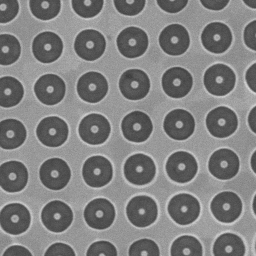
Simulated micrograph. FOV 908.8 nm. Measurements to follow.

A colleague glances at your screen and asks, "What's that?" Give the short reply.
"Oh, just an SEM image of an array of small figures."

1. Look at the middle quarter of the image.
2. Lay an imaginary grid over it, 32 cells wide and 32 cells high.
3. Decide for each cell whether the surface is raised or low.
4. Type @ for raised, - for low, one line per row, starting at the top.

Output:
@@@@@@@@@@@@@@@@@@@@@@@@@@@@@@@@
@@@@@@@@@@@@@@@@---@@@@@@@-----@
@@@@@----@@@@@@------@@@@-------
@@@@------@@@@-------@@@--------
@@@--------@@@---@----@@----@---
@@@---@@---@@@---@----@@--------
@@@--------@@@-------@@@@-------
@@@--------@@@-------@@@@------@
@@@@------@@@@@-----@@@@@@@--@@@
@@@@@@---@@@@@@@@@@@@@@@@@@@@@@@
@@@@@@@@@@@@@@@@@@@@@@@@@@@@@@@@
@@@@@@@@@@@@@@@@@@@@@@@@@@@---@@
@@@@@@---@@@@@@@-----@@@@@------
@@@@@------@@@@-------@@@-------
@@@@-------@@@--------@@@-------
-@@@--------@@---@@---@@@---@---
-@@----@----@@----@---@@@-------
-@@@--------@@@-------@@@@------
-@@@-------@@@@------@@@@@@----@
@@@@@-----@@@@@@@---@@@@@@@@@@@@
@@@@@@@@@@@@@@@@@@@@@@@@@@@@@@@@
@@@@@@@@@@@@@@@@@@@@@@@@@@@@@@@@
@@@@@@@@@@@@@@@@@----@@@@@@-----
@@@@@@-----@@@@@------@@@@------
-@@@@-------@@@--------@@-------
-@@@@-------@@@--------@@----@--
--@@----@----@@---@----@@-------
--@@@---@---@@@--------@@-------
--@@@-------@@@--------@@@------
-@@@@-------@@@@------@@@@@----@
@@@@@@----@@@@@@@@--@@@@@@@@@@@@
@@@@@@@@@@@@@@@@@@@@@@@@@@@@@@@@